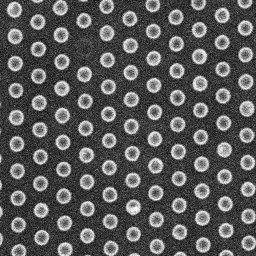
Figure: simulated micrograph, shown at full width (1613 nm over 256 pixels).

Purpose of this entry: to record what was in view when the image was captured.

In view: a regular array of raised bodies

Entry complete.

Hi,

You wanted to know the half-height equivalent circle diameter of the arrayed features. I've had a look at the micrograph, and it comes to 86.4 nm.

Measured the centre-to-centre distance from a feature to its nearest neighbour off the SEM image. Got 165 nm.